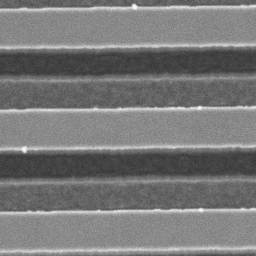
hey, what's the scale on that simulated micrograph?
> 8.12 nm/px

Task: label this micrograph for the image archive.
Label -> lines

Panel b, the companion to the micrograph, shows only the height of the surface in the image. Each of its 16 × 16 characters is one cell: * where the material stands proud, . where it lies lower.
****************
****************
****************
................
................
****************
****************
****************
****************
................
................
****************
****************
****************
****************
****************